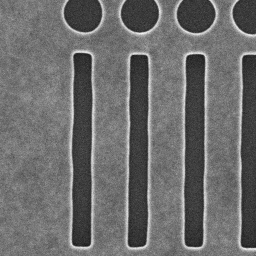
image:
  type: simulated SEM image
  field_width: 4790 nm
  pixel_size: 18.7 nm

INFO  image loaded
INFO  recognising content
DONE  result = groups of lines, slits or small figures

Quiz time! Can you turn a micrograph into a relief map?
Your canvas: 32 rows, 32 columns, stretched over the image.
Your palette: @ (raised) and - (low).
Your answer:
@@@@@@@@-----@@-----@@-----@@---
@@@@@@@@-----@@-----@@-----@@---
@@@@@@@@-----@@-----@@-----@@---
@@@@@@@@@---@@@@---@@@@---@@@@--
@@@@@@@@@@@@@@@@@@@@@@@@@@@@@@@@
@@@@@@@@@@@@@@@@@@@@@@@@@@@@@@@@
@@@@@@@@@@@@@@@@@@@@@@@@@@@@@@@@
@@@@@@@@@---@@@@---@@@@---@@@@--
@@@@@@@@@---@@@@---@@@@---@@@@--
@@@@@@@@@---@@@@---@@@@---@@@@--
@@@@@@@@@---@@@@---@@@@---@@@@--
@@@@@@@@@---@@@@---@@@@---@@@@--
@@@@@@@@@---@@@@---@@@@---@@@@--
@@@@@@@@@---@@@@---@@@@---@@@@--
@@@@@@@@@---@@@@---@@@@---@@@@--
@@@@@@@@@---@@@@---@@@@---@@@@--
@@@@@@@@@---@@@@---@@@@---@@@@--
@@@@@@@@@---@@@@---@@@@---@@@@--
@@@@@@@@@---@@@@---@@@@---@@@@--
@@@@@@@@@--@@@@@---@@@@---@@@@--
@@@@@@@@@--@@@@@---@@@@---@@@@--
@@@@@@@@@--@@@@@---@@@@---@@@@--
@@@@@@@@@---@@@@---@@@@---@@@@--
@@@@@@@@@---@@@@---@@@@---@@@@--
@@@@@@@@@---@@@@---@@@@---@@@@--
@@@@@@@@@---@@@@---@@@@---@@@@--
@@@@@@@@@--@@@@@---@@@@---@@@@--
@@@@@@@@@--@@@@@---@@@@---@@@@--
@@@@@@@@@--@@@@@--@@@@@---@@@@--
@@@@@@@@@--@@@@@--@@@@@---@@@@--
@@@@@@@@@--@@@@@--@@@@@--@@@@@--
@@@@@@@@@@@@@@@@@@@@@@@@@@@@@@@@